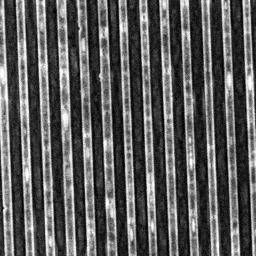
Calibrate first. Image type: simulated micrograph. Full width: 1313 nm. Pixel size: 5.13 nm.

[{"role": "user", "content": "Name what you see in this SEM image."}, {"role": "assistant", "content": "parallel lines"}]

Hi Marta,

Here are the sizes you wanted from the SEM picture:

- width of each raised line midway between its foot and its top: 0.0391 um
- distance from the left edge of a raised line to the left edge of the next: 0.106 µm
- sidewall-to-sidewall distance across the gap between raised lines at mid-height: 64.1 nm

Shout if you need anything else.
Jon